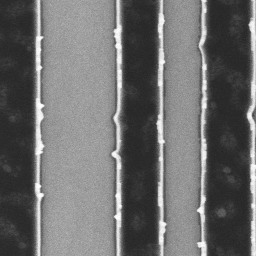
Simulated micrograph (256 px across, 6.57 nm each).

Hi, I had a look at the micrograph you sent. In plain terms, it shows one or a few lines or trenches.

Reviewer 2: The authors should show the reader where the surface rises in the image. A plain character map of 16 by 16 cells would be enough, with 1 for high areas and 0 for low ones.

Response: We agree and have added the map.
1100000111000111
1100000111000111
1110000111000111
1100000111000111
1100000111000111
1100000111000111
1110000111000111
1110000111000111
1110000111000111
1110000111000111
1100000111000111
1100000111000111
1110000111000111
1100000111001111
1100000111000111
1100000111000111